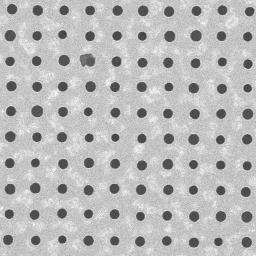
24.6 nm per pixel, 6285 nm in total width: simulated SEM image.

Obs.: a regular array of holes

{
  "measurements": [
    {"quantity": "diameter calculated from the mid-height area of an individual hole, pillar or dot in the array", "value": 252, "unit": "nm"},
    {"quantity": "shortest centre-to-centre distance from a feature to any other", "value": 25.1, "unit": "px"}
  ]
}